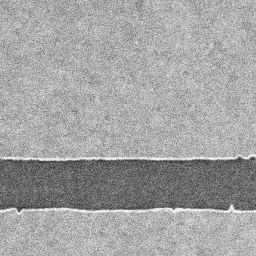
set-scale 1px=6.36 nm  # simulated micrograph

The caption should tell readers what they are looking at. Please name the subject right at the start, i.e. one or a few lines or trenches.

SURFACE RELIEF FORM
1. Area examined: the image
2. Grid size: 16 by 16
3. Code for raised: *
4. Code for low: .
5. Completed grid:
****************
****************
****************
****************
****************
****************
****************
****************
****************
****************
................
................
................
****************
****************
****************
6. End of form